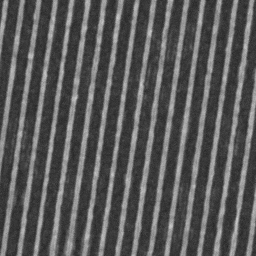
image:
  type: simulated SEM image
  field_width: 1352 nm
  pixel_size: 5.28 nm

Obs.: parallel lines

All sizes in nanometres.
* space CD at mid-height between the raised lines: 63.3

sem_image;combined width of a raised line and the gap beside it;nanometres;85.6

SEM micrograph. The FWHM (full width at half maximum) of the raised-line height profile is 22.2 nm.